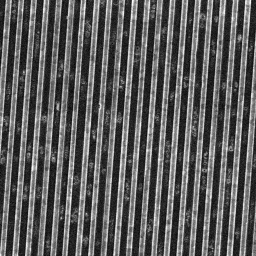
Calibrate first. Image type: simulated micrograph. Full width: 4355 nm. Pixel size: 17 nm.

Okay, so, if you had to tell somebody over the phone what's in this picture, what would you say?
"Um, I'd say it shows parallel lines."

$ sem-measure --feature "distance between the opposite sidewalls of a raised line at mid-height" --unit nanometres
74.2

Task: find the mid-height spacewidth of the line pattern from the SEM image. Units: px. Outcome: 7.85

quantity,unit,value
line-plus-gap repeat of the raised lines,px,12.6